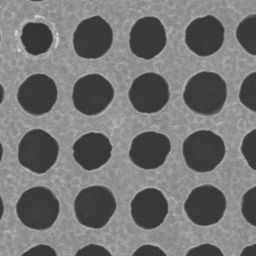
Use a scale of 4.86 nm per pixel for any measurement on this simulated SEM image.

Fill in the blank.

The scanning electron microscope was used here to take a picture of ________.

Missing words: a regular array of holes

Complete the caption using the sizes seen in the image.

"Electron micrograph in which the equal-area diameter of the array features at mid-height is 197 nm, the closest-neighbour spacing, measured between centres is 265 nanometres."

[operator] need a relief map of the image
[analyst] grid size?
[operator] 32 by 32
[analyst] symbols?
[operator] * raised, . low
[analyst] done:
********************************
********************************
***********..****...****...****.
***...****....**....***.....**..
***....**.....**.....**.....**..
***...***.....**.....**.....**..
***...***....***....****...****.
********************************
********************************
****..*****..****...****...****.
***....**.....***....**.....**..
**.....**.....**.....**.....**..
**.....**.....**.....**.....**..
***...****...****...****....***.
********************************
********************************
****..******************...****.
***....***....***....**.....**..
**.....**.....**.....**.....**..
**.....**.....**.....**.....**..
***....***...****...***....****.
****..*******************.******
********************************
****..*****..************..*****
***....***....***...****....***.
**.....**......*.....**.....**..
**.....**.....**.....**.....**..
***....***....***...****...****.
****..*****.******.*************
********************************
***********.********************
***....***....***...****....**..